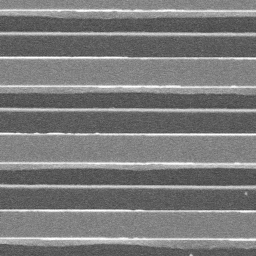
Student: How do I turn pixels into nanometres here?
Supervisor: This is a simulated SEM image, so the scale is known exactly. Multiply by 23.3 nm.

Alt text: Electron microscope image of lines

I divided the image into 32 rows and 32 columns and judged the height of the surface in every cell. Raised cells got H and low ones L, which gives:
HHHHHHHHHHHHHHHHHHHHHHHHHHHHHHHH
LLLLLLLLLLLLLLLLLLLLLLLLLLLLLLLL
LLLLLLLLLLLLLLLLLLLLLLLLLLLLLLLL
LLLLLLLLLLLLLLLLLLLLLLLLLLLLLLLL
LLLLLLLLLLLLLLLLLLLLLLLLLLLLLLLL
LLLLLLLLLLLLLLLLLLLLLLLLLLLLLLLL
LLLLLLLLLLLLLLLLLLLLLLLLLLLLLLLL
HHHHHHHHHHHHHHHHHHHHHHHHHHHHHHHH
HHHHHHHHHHHHHHHHHHHHHHHHHHHHHHHH
HHHHHHHHHHHHHHHHHHHHHHHHHHHHHHHH
HHHHHHHHHHHHHHHHHHHHHHHHHHHHHHHH
LLLLLLLLLLLLLLLLLLLLLLLLLLLLLLLL
LLLLLLLLLLLLLLLLLLLLLLLLLLLLLLLL
LLLLLLLLLLLLLLLLLLLLLLLLLLLLLLLL
LLLLLLLLLLLLLLLLLLLLLLLLLLLLLLLL
LLLLLLLLLLLLLLLLLLLLLLLLLLLLLLLL
LLLLLLLLLLLLLLLLLLLLLLLLLLLLLLLL
HHHHHHHHHHHHHHHHHHHHHHHHHHHHHHHH
HHHHHHHHHHHHHHHHHHHHHHHHHHHHHHHH
HHHHHHHHHHHHHHHHHHHHHHHHHHHHHHHH
LLLLLLLLLLLLLLLLLLLLLLLLLLLLLLLL
LLLLLLLLLLLLLLLLLLLLLLLLLLLLLLLL
LLLLLLLLLLLLLLLLLLLLLLLLLLLLLLLL
LLLLLLLLLLLLLLLLLLLLLLLLLLLLLLLL
LLLLLLLLLLLLLLLLLLLLLLLLLLLLLLLL
LLLLLLLLLLLLLLLLLLLLLLLLLLLLLLLL
HHHHHHHHHHHHHHHHHHHHHHHHHHHHHHHH
HHHHHHHHHHHHHHHHHHHHHHHHHHHHHHHH
HHHHHHHHHHHHHHHHHHHHHHHHHHHHHHHH
HHHHHHHHHHHHHHHHHHHHHHHHHHHHHHHH
LLLLLLLLLLLLLLLLLLLLLLLLLLLLLLLL
LLLLLLLLLLLLLLLLLLLLLLLLLLLLLLLL